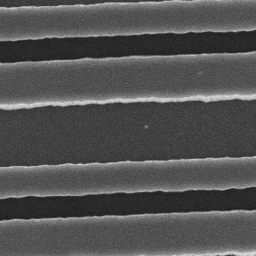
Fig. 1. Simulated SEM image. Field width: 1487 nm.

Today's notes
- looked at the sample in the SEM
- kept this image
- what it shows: lines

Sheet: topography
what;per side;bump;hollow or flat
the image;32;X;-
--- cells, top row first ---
-------------XXXXXXXXXXXXXXXXXXX
XXXXXXXXXXXXXXXXXXXXXXXXXXXXXXXX
XXXXXXXXXXXXXXXXXXXXXXXXXXXXXXXX
XXXXXXXXXXXXXXXXXXXXXXXXXXXXXXXX
XXXXXXXXXXXX--------------------
--------------------------------
--------------------------------
---------XXXXXXXXXXXXXXXXXXXXXXX
XXXXXXXXXXXXXXXXXXXXXXXXXXXXXXXX
XXXXXXXXXXXXXXXXXXXXXXXXXXXXXXXX
XXXXXXXXXXXXXXXXXXXXXXXXXXXXXXXX
XXXXXXXXXXXXXXXXXXXXXXXXXXXXXXXX
XXXXXXXXXXXXXXXXXX--X-----------
--------------------------------
--------------------------------
--------------------------------
--------------------------------
--------------------------------
--------------------------------
--------------------------------
--------XXXXXXXXXXXXXXXXXXXXXXXX
XXXXXXXXXXXXXXXXXXXXXXXXXXXXXXXX
XXXXXXXXXXXXXXXXXXXXXXXXXXXXXXXX
XXXXXXXXXXXXXXXXXXXXXXXXXXXXX---
XXXXXX--------------------------
--------------------------------
--------------------------XXXXXX
-XXXXXXXXXXXXXXXXXXXXXXXXXXXXXXX
XXXXXXXXXXXXXXXXXXXXXXXXXXXXXXXX
XXXXXXXXXXXXXXXXXXXXXXXXXXXXXXXX
XXXXXXXXXXXXXXXXXXXXXXXXXXXXXXXX
XXXXXXXXXXXXXXXXXXXXXXXXXXXXXXXX